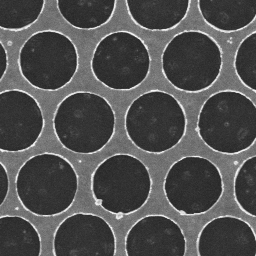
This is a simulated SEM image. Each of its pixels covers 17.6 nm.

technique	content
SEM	a regular array of holes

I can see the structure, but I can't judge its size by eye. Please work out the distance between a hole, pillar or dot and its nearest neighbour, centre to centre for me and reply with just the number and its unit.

1250 nanometers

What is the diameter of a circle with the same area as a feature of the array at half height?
1040 nanometers